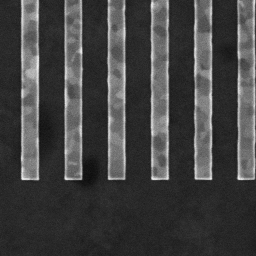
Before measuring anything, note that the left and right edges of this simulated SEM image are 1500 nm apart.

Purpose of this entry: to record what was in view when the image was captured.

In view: wiring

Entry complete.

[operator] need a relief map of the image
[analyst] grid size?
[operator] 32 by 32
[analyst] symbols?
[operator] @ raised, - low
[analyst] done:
---@@---@@----@@---@@---@@----@@
---@@---@@----@@---@@---@@----@@
---@@---@@---@@@---@@---@@----@@
---@@---@@----@@---@@---@@----@@
---@@---@@----@@---@@---@@----@@
---@@---@@----@@---@@---@@----@@
---@@---@@----@@---@@---@@----@@
---@@---@@---@@@---@@---@@----@@
---@@---@@----@@---@@---@@----@@
---@@---@@---@@@---@@---@@----@@
---@@---@@---@@@---@@---@@----@@
---@@---@@----@@---@@---@@----@@
---@@---@@----@@---@@---@@----@@
---@@---@@----@@---@@---@@----@@
---@@---@@----@@---@@---@@----@@
---@@---@@----@@---@@---@@----@@
---@@---@@----@@---@@---@@----@@
---@@---@@----@@---@@---@@----@@
---@@---@@----@@---@@---@@----@@
---@@---@@----@@---@@---@@----@@
---@@---@@----@@---@@---@@----@@
---@@---@@----@@---@@---@@----@@
--------------------------------
--------------------------------
--------------------------------
--------------------------------
--------------------------------
--------------------------------
--------------------------------
--------------------------------
--------------------------------
--------------------------------